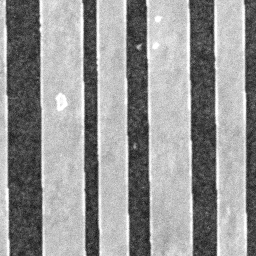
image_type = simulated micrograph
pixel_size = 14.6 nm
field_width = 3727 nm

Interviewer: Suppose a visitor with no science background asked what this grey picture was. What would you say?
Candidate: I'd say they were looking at lines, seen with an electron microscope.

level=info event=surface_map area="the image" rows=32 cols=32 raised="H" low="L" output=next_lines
HLLLLHHHHHLLHHHHLLHHHHHHLLLHHHLL
HLLLLHHHHHLLHHHHLLHHHHHHLLLHHHLL
HLLLLHHHHHLLHHHHLLHHHHHHLLLHHHLL
HLLLLHHHHHLLHHHHLLHHHHHHLLLHHHHL
HLLLLHHHHHLLHHHHLLHHHHHHLLLHHHHL
HLLLLHHHHHLLHHHHLLHHHHHHLLLHHHHL
HLLLLHHHHHLLHHHHLLHHHHHHLLLHHHHL
HLLLLHHHHHLLHHHHLLHHHHHHLLLHHHHL
HLLLLHHHHHLLHHHHLLLHHHHHLLLHHHHL
HLLLLHHHHHLLHHHHLLLHHHHHLLLHHHHL
HLLLLHHHHHLLHHHHLLLHHHHHLLLHHHHL
HLLLLHHHHHLLHHHHLLLHHHHHLLLHHHHL
HLLLLHHHHHLLHHHHLLLHHHHHLLLHHHHL
HLLLLHHHHHLLHHHHLLLHHHHHLLLHHHHL
HLLLLHHHHHLLHHHHLLLHHHHHLLLHHHHL
HLLLLHHHHHLLHHHHLLLHHHHHLLLHHHHL
HLLLLHHHHHLLHHHHLLLHHHHHLLLHHHHL
HLLLLHHHHHLLHHHHLLLHHHHHLLLHHHHL
HLLLLHHHHHLLHHHHLLLHHHHHLLLHHHHL
HLLLLHHHHHLLHHHHLLLHHHHHLLLHHHHL
HLLLLHHHHHLLHHHHLLLHHHHHLLLHHHHL
HLLLLHHHHHLLHHHHLLLHHHHHLLLHHHHL
HLLLLHHHHHLLHHHHLLLHHHHHLLLHHHHL
HLLLLHHHHHLLHHHHLLLHHHHHLLLHHHHL
HLLLLHHHHHLLHHHHLLLHHHHHLLLHHHHL
HLLLLHHHHHHLHHHHLLLHHHHHLLLHHHHL
HLLLLHHHHHHLHHHHLLLHHHHHLLLHHHHL
HLLLLHHHHHHLHHHHLLLHHHHHLLLHHHHL
HLLLLHHHHHHLHHHHLLLHHHHHLLLHHHHL
HLLLLHHHHHHLLHHHLLLHHHHHLLLHHHHL
HLLLLHHHHHHLLHHHLLLHHHHHLLLHHHHL
HLLLLHHHHHHLLHHHLLLHHHHHLLLHHHHL